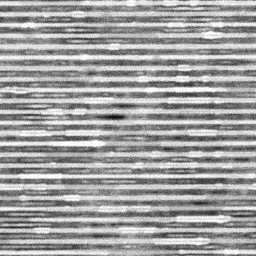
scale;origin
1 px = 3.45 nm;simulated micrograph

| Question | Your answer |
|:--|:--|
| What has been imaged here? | parallel lines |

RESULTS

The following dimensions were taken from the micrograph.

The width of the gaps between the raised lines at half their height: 25.5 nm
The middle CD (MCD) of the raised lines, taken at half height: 12.9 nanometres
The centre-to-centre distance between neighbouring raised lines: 37.4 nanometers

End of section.